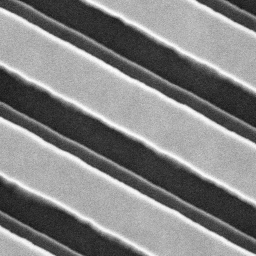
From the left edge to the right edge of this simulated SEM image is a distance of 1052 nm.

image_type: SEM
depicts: lines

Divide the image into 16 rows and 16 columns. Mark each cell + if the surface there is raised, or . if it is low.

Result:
......+++++++...
++......+++++++.
++++......++++++
++++++......++++
.+++++++......++
...++++++......+
.....++++++.....
......+++++++...
++......+++++++.
++++......++++++
++++++......++++
.+++++++......++
...+++++++.....+
.....+++++++....
+......++++++...
+++.....+++++++.